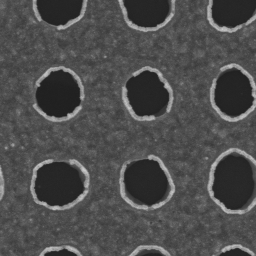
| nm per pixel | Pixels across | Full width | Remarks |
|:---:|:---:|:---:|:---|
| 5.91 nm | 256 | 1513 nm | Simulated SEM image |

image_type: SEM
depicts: holes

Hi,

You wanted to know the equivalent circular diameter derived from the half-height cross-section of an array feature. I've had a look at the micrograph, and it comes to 266 nm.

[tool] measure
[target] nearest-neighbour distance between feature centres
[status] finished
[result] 517 nm